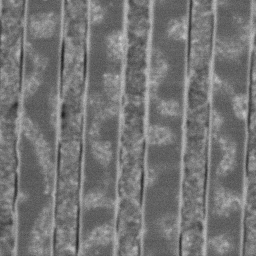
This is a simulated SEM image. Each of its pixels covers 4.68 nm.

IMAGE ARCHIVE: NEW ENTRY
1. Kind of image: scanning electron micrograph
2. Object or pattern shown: one or a few lines or trenches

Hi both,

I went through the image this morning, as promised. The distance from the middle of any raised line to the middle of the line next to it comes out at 0.296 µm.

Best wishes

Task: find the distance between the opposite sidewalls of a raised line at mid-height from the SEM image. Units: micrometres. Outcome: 0.178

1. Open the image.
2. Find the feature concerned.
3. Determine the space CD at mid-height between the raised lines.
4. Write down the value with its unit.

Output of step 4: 117 nanometres